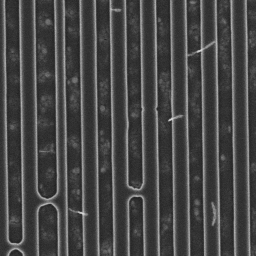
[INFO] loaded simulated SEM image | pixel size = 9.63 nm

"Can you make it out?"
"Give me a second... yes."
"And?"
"parallel lines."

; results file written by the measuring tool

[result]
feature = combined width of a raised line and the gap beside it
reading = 291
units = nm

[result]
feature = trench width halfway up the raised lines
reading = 138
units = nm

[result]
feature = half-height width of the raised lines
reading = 154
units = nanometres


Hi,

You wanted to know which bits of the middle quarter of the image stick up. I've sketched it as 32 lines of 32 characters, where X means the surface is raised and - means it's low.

----XXXX----XXX-----XXX----XXXX-
----XXXX----XXX-----XXX----XXXX-
----XXXX----XXXX----XXX----XXXX-
----XXXX----XXXX----XXX----XXXX-
----XXXX----XXXX----XXX----XXXX-
----XXXX----XXXX----XXX----XXXX-
----XXXX----XXXX----XXX----XXXX-
----XXXX----XXXX---XXXX----XXXX-
----XXXX----XXXX---XXXX----XXXX-
----XXXX----XXXX---XXXX----XXXX-
----XXXX----XXXX---XXXX----XXXX-
----XXXX----XXXX---XXXX----XXXX-
-----XXX----XXXX---XXXX----XXXX-
X----XXX----XXXX---XXXX----XXXX-
X----XXX----XXXX---XXXX----XXXX-
X----XXX----XXXX----XXX----XXXX-
X----XXX----XXXX----XXX----XXXX-
X----XXX----XXXX----XXX----XXXX-
X----XXX----XXXX----XXX----XXXX-
-----XXX----XXXX----XXX----XXXX-
-----XXX----XXXX----XXX----XXXX-
-----XXX----XXXX----XXX----XXXX-
-----XXX----XXXX----XXX----XXXX-
-----XXX----XXXX----XXX----XXXX-
-----XXX----XXXX----XXX----XXXX-
-----XXX----XXXX----XXX----XXXX-
-----XXX----XXXX----XXX----XXXX-
X----XXXX---XXXX----XXX----XXXX-
X----XXXX---XXXX----XXX----XXXX-
X----XXXX---XXXX----XXX----XXXX-
X----XXX----XXXX---XXXX----XXXX-
X----XXX----XXXXXXXXXXXX---XXXX-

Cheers